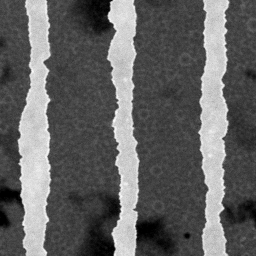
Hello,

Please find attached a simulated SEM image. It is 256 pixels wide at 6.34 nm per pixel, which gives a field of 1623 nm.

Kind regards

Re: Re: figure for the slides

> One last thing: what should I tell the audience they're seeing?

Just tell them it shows one or a few lines or trenches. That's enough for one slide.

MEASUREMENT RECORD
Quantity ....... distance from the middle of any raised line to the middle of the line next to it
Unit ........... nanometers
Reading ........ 566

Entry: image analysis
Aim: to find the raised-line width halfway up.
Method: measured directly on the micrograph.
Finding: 124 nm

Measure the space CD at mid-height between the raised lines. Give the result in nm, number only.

428